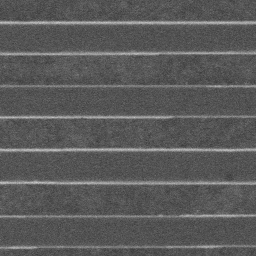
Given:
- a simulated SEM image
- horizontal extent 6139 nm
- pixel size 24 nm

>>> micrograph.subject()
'lines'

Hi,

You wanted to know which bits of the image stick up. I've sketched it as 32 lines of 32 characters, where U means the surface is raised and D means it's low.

DDDDDDDDDDDDDDDDDDDDDDDDDDDDDDDD
DDDDDDDDDDDDDDDDDDDDDDDDDDDDDDDD
DDDDDDDDDDDDDDDDDDDDDDDDDDDDDDDD
UUUUUUUUUUUUUUUUUUUUUUUUUUUUUUUU
UUUUUUUUUUUUUUUUUUUUUUUUUUUUUUUU
UUUUUUUUUUUUUUUUUUUUUUUUUUUUUUUU
UUUUUUUUUUUUUUUUUUUUUUUUUUUUUUUU
DDDDDDDDDDDDDDDDDDDDDDDDDDDDDDDD
DDDDDDDDDDDDDDDDDDDDDDDDDDDDDDDD
DDDDDDDDDDDDDDDDDDDDDDDDDDDDDDDD
DDDDDDDDDDDDDDDDDDDDDDDDDDDDDDDD
UUUUUUUUUUUUUUUUUUUUUUUUUUUUUUUU
UUUUUUUUUUUUUUUUUUUUUUUUUUUUUUUU
UUUUUUUUUUUUUUUUUUUUUUUUUUUUUUUU
UUUUUUUUUUUUUUUUUUUUUUUUUUUUUUUU
DDDDDDDDDDDDDDDDDDDDDDDDDDDDDDDD
DDDDDDDDDDDDDDDDDDDDDDDDDDDDDDDD
DDDDDDDDDDDDDDDDDDDDDDDDDDDDDDDD
DDDDDDDDDDDDDDDDDDDDDDDDDDDDDDDD
UUUUUUUUUUUUUUUUUUUUUUUUUUUUUUUU
UUUUUUUUUUUUUUUUUUUUUUUUUUUUUUUU
UUUUUUUUUUUUUUUUUUUUUUUUUUUUUUUU
UUUUUUUUUUUUUUUUUUUUUUUUUUUUUUUU
DDDDDDDDDDDDDDDDDDDDDDDDDDDDDDDD
DDDDDDDDDDDDDDDDDDDDDDDDDDDDDDDD
DDDDDDDDDDDDDDDDDDDDDDDDDDDDDDDD
DDDDDDDDDDDDDDDDDDDDDDDDDDDDDDDD
UUUUUUUUUUUUUUUUUUUUUUUUUUUUUUUU
UUUUUUUUUUUUUUUUUUUUUUUUUUUUUUUU
UUUUUUUUUUUUUUUUUUUUUUUUUUUUUUUU
UUUUUUUUUUUUUUUUUUUUUUUUUUUUUUUU
DDDDDDDDDDDDDDDDDDDDDDDDDDDDDDDD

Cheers